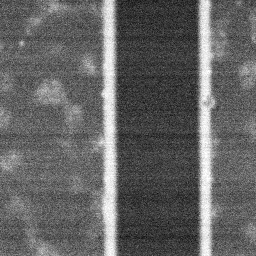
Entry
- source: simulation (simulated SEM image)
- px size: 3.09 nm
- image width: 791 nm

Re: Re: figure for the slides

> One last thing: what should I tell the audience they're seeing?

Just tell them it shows one or a few lines or trenches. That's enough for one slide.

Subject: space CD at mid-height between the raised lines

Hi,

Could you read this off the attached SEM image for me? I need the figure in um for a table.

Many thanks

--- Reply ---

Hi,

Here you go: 0.293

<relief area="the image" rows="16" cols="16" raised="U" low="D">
UUUUUUUDDDDDDUUU
UUUUUUUDDDDDDUUU
UUUUUUUDDDDDDUUU
UUUUUUUDDDDDDUUU
UUUUUUUDDDDDDUUU
UUUUUUUDDDDDDUUU
UUUUUUUDDDDDDUUU
UUUUUUUDDDDDDUUU
UUUUUUUDDDDDDUUU
UUUUUUUDDDDDDUUU
UUUUUUUDDDDDDUUU
UUUUUUUDDDDDDUUU
UUUUUUUDDDDDDUUU
UUUUUUUDDDDDDUUU
UUUUUUUDDDDDDUUU
UUUUUUUDDDDDDUUU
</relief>